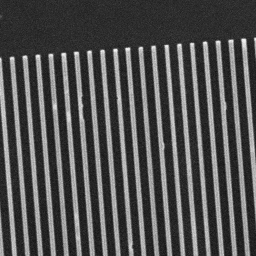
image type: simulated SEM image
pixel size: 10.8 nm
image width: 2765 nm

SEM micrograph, parallel lines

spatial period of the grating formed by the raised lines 139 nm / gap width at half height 101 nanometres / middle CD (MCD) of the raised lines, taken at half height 0.0377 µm